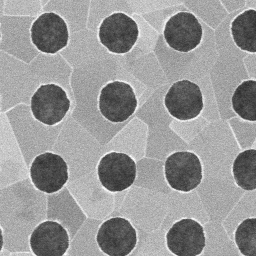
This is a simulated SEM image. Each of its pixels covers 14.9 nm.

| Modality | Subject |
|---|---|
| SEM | a regular array of holes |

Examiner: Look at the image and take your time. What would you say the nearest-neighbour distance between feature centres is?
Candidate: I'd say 1000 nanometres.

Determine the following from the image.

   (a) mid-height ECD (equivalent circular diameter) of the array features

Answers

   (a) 590 nanometers